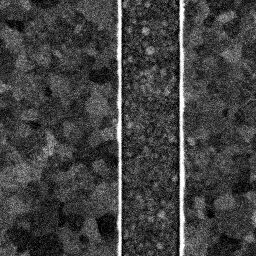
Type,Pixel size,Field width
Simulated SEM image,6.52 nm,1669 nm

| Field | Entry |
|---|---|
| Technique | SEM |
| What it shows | one or a few lines or trenches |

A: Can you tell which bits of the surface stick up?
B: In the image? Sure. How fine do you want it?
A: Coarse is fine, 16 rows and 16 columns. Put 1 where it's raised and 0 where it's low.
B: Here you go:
1111111100011111
1111111100011111
1111111100011111
1111111100011111
1111111100011111
1111111100011111
1111111100011111
1111111100011111
1111111100011111
1111111100011111
1111111100011111
1111111100011111
1111111100011111
1111111100011111
1111111100011111
1111111100011111